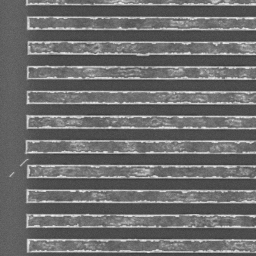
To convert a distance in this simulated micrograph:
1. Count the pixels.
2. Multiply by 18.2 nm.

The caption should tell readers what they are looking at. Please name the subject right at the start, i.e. parallel lines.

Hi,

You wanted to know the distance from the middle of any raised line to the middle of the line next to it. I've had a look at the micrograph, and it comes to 450 nanometers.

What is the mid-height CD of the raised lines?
225 nanometres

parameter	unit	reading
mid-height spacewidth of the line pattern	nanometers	225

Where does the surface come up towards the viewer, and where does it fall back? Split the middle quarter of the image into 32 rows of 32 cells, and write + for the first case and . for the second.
................................
++++++++++++++++++++++++++++++++
++++++++++++++++++++++++++++++++
++++++++++++++++++++++++++++++++
................................
................................
................................
++++++++++++++++++++++++++++++++
++++++++++++++++++++++++++++++++
++++++++++++++++++++++++++++++++
................................
................................
................................
++++++++++++++++++++++++++++++++
++++++++++++++++++++++++++++++++
++++++++++++++++++++++++++++++++
................................
................................
................................
++++++++++++++++++++++++++++++++
++++++++++++++++++++++++++++++++
++++++++++++++++++++++++++++++++
................................
................................
................................
+++++++++++++++++++.............
++++++++++++++++++++++++++++++++
++++++++++++++++++++++++++++++++
+..............++.........++++++
................................
................................
................................